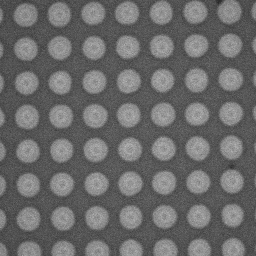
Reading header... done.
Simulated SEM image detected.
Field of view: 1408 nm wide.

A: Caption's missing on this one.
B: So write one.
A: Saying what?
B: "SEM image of an array of small figures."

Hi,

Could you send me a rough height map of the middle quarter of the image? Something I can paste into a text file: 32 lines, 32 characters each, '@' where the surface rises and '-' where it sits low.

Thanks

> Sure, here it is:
--------------------------------
----------------@-------@@------
@-----@@@@----@@@@----@@@@@----@
@@---@@@@@---@@@@@@---@@@@@---@@
@@---@@@@@---@@@@@@---@@@@@---@@
@@---@@@@@----@@@@@---@@@@@----@
@-----@@@@----@@@@-----@@@------
--------------------------------
--------------------------------
--------------------------------
@-----@@@-----@@@@-----@@@@----@
@@---@@@@@----@@@@@---@@@@@----@
@@---@@@@@@--@@@@@@---@@@@@@--@@
@@---@@@@@@--@@@@@@---@@@@@@---@
@@---@@@@@----@@@@@----@@@@----@
@-----@@@------@@---------------
--------------------------------
--------------------------------
------------------------@@------
@-----@@@@----@@@@@----@@@@----@
@@---@@@@@@---@@@@@---@@@@@@---@
@@---@@@@@@---@@@@@---@@@@@@---@
@@---@@@@@@---@@@@@---@@@@@@---@
@@----@@@@-----@@@-----@@@@-----
--------------------------------
--------------------------------
--------------------------------
@------@@------@@@-----@@@@-----
@@----@@@@@---@@@@@---@@@@@@---@
@@---@@@@@@---@@@@@---@@@@@@---@
@@---@@@@@@---@@@@@---@@@@@@---@
@@----@@@@----@@@@@----@@@@----@